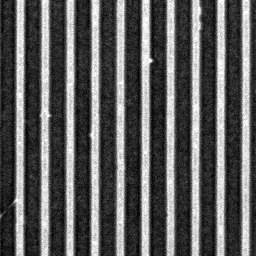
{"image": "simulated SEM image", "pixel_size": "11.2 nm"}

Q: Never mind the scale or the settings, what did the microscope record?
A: parallel lines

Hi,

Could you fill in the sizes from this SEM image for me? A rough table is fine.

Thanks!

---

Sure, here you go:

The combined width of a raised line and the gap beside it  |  281 nanometers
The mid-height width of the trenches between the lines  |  182 nanometers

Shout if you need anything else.